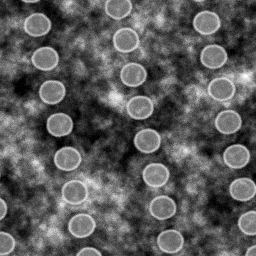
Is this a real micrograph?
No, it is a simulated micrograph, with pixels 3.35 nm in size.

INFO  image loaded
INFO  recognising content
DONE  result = a regular array of raised bodies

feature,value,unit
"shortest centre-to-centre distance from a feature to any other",114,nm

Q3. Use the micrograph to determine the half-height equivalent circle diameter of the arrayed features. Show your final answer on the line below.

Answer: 0.0802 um